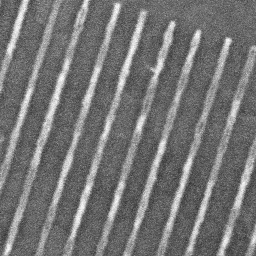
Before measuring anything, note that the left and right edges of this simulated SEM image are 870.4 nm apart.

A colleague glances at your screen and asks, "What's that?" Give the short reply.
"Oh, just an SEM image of parallel lines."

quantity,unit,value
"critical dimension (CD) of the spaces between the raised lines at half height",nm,79.8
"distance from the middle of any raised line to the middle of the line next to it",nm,98.6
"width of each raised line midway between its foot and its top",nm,16.6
